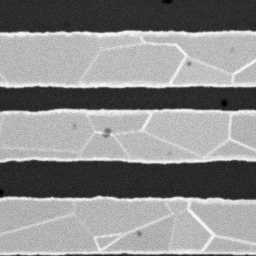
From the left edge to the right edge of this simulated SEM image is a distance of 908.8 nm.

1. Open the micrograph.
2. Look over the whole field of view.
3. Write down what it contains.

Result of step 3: lines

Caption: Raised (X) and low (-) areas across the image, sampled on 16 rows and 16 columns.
----------------
----------------
XXXXXXXXXXXXXXXX
XXXXXXXXXXXXXXXX
XXXXXXXXXXXXXXXX
----------------
----------------
XXXXXXXXXXXXXXXX
XXXXXXXXXXXXXXXX
XXXXXXXXXXXXXXXX
----------------
----------------
XXXXXXXXXXXXXX--
XXXXXXXXXXXXXXXX
XXXXXXXXXXXXXXXX
XXXXXXXXXXXXXXXX